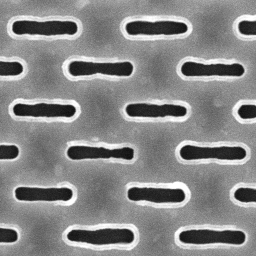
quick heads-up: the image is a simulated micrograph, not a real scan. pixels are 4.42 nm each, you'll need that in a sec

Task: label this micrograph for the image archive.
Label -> a regular array of holes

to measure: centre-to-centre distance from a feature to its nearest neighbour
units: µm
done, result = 0.305